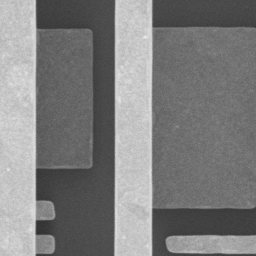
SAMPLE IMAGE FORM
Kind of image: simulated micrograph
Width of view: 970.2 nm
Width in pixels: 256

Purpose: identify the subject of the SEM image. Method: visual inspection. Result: wiring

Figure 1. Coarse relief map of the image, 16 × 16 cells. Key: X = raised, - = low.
XX-----XX-------
XX-----XX-------
XX-----XX-------
XX-----XX-------
XX-----XX-------
XX-----XX-------
XX-----XX-------
XX-----XX-------
XX-----XX-------
XX-----XX-------
XX-----XX-------
XX-----XX-------
XX-----XX-------
XX-----XX-------
XX-----XX-------
XX-----XX-------